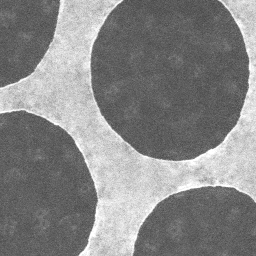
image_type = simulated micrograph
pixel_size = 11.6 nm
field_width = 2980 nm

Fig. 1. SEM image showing holes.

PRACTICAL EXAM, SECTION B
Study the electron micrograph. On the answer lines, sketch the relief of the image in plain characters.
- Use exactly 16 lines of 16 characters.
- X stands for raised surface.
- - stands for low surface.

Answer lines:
----XXX-------XX
----XX---------X
---XXX---------X
---XXX----------
--XXXX----------
XXXXXX----------
XXXXXX---------X
---XXXX--------X
----XXX-------XX
-----XXXX----XXX
------XXXXXXXXXX
------XXXXXXXXXX
------XXXX------
------XXX-------
-------XX-------
-----XXX--------